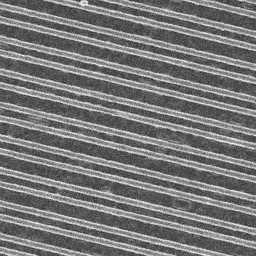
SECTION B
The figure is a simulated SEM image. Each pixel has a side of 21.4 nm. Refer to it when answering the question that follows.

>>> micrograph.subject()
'parallel lines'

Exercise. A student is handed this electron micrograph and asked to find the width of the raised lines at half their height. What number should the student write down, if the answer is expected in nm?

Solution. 127